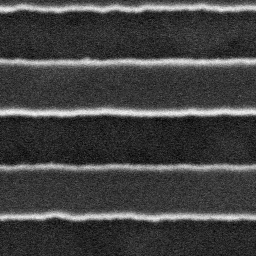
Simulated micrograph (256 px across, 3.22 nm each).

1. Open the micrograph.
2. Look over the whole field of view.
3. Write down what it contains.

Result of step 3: lines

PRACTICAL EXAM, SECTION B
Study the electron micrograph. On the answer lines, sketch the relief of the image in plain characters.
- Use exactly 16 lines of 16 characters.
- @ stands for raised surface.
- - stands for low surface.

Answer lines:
@@@@@@@@@@@@@@@@
----------------
----------------
----------------
@@@@@@@@@@@@@@@@
@@@@@@@@@@@@@@@@
@@@@@@@@@@@@@@@@
----------------
----------------
----------------
@@@@@@@@@@@@@@@@
@@@@@@@@@@@@@@@@
@@@@@@@@@@@@@@@@
@@@@@@@@@@@@@@@@
----------------
----------------